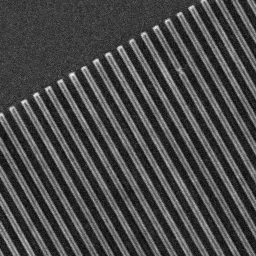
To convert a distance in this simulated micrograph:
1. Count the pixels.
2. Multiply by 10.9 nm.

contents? parallel lines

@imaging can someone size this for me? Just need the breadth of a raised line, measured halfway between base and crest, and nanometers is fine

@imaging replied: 48.8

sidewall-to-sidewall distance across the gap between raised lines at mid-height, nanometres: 97.5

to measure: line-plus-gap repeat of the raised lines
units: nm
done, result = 150